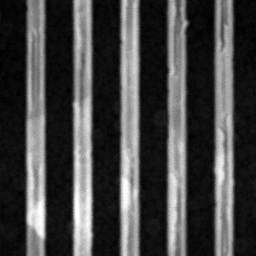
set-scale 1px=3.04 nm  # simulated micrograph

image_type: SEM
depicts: parallel lines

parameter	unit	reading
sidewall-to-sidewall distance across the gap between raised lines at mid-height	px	32.4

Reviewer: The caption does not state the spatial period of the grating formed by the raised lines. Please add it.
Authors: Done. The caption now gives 47 pixels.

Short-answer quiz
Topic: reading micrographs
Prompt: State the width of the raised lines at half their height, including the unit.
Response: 44.8 nanometres